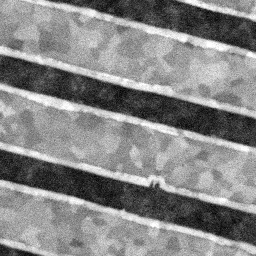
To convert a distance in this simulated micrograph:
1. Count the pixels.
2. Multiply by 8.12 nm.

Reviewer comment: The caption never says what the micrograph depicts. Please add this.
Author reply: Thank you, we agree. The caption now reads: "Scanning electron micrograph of one or a few lines or trenches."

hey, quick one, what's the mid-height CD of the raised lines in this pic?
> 477 nm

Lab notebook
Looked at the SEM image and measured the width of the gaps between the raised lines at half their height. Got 34.7 px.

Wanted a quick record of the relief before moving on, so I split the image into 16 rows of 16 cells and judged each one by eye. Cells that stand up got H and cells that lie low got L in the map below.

HHHHLLLLLLLLLHHH
HHHHHHHHLLLLLLLL
HHHHHHHHHHHHLLLL
LLHHHHHHHHHHHHHH
LLLLLHHHHHHHHHHH
LLLLLLLLLHHHHHHH
HHHHLLLLLLLLLHHH
HHHHHHHHLLLLLLLL
HHHHHHHHHHHHLLLL
LHHHHHHHHHHHHHHH
LLLLLHHHHHHHHHHH
LLLLLLLLLLHHHHHH
HHHHLLLLLLLLLHHH
HHHHHHHHLLLLLLLL
HHHHHHHHHHHHLLLL
LLHHHHHHHHHHHHHH